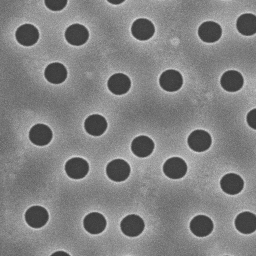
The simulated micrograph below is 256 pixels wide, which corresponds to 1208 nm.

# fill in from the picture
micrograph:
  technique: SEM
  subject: a regular array of holes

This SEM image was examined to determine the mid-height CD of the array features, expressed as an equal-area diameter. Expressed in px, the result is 23.6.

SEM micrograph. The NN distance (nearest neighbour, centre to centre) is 223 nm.